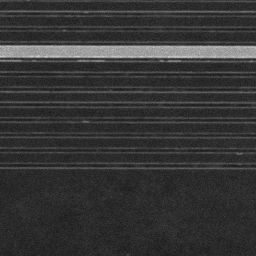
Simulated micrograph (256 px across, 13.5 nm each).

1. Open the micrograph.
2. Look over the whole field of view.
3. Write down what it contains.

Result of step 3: parallel lines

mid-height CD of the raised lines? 155 nanometers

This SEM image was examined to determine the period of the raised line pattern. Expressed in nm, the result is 205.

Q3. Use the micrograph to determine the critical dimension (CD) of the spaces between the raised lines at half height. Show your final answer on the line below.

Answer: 48.9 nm